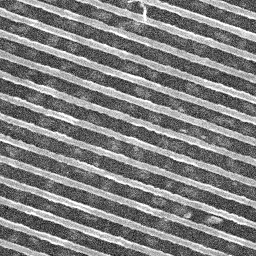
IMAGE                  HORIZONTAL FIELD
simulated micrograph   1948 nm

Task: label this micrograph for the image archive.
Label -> parallel lines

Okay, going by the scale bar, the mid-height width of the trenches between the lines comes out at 103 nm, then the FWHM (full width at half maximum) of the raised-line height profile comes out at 47.6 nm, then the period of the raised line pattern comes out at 150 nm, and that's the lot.